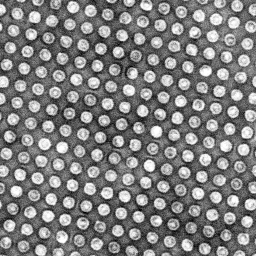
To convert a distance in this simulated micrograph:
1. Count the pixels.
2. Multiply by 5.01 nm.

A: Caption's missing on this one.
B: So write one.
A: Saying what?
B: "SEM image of a regular array of raised bodies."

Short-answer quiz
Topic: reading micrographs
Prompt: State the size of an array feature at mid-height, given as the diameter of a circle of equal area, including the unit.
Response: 53 nanometers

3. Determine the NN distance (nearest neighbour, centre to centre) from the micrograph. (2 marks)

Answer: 86.8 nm